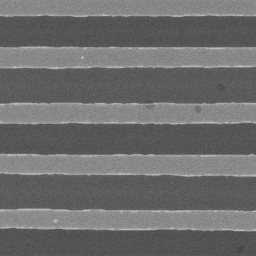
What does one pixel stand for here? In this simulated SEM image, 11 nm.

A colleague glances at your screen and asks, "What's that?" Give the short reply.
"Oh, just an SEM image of lines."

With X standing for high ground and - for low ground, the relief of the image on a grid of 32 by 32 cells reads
XXXXXXXXXXXXXXXXXXXXXXXXXXXXXXXX
XXXXXXXXXXXXXXXXXXXXXXXXXXXXXXXX
--------------------------------
--------------------------------
--------------------------------
--------------------------------
XXXXXXXXXXXXXXXXXXXXXXXXXXXXXXXX
XXXXXXXXXXXXXXXXXXXXXXXXXXXXXXXX
------XX------------------------
--------------------------------
--------------------------------
--------------------------------
--------------------------------
XXXXXXXXXXXXXXXXXXXXXXXXXXXXXXXX
XXXXXXXXXXXXXXXXXXXXXXXXXXXXXXXX
--------------------------------
--------------------------------
--------------------------------
--------------------------------
XXXXXXXXXXXXXXXXXXXXXXXXXXXXXXXX
XXXXXXXXXXXXXXXXXXXXXXXXXXXXXXXX
XXXXXXXXXXXXXXXXXXXXXXXXXXXXXXXX
--------------------------------
--------------------------------
--------------------------------
--------------------------------
XXXXXXXXXXXXXXXXXXXXXXXXXXXXXXXX
XXXXXXXXXXXXXXXXXXXXXXXXXXXXXXXX
----XXXXXXXXXXXXXXXXXXXXXXXXXXXX
--------------------------------
--------------------------------
--------------------------------